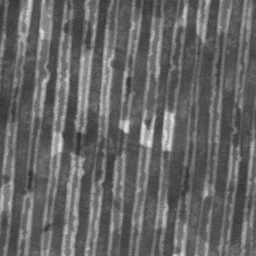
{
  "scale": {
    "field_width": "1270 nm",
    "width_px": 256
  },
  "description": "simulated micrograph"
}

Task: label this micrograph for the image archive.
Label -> parallel lines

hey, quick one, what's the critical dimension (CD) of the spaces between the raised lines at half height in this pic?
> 60.4 nm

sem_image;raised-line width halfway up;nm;47.2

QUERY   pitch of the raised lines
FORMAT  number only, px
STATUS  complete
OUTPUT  22.2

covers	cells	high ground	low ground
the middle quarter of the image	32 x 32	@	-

@---@@@---@----@@----@@@---@@---
@---@@----@@---@@----@@@--@@@---
@---@@----@@---@@----@@@--@@@---
@---@@----@@---@@----@@@--@@@---
@---@@----@@---@@----@@@--@@@---
@---@@---@@----@@----@@@--@@----
@---@@---@@----@@----@@---@@----
@---@@---@@----@@---@@@---@@----
@---@@---@@----@@---@@@---@@----
@---@@---@@----@@---@@@---@@----
@---@@---@@---@@@---@@@---@@----
----@----@@---@@@---@@@--@@@----
---@@@---@@---@@----@@@--@@@---@
---@@----@@---@@----@@---@@----@
---@@@---@@---@@----@@---@@----@
---@@----@@---@@----@@---@@----@
---@@----@@---@@----@@---@@----@
--@@@----@@---@@---@@@---@@----@
--@@@---@@@---@@---@@@---@@----@
--@@@---@@@---@----@@@---@@----@
---@@---@@@--@@----@@@---@-----@
--@@@---@@@--@@----@@@---@-----@
--@@@---@@---@@----@@@--@@-----@
--@@@---@@---@@----@@---@@----@@
--@@@---@@---@@----@@---@@----@@
--@@----@@---@@----@@---@@----@@
--@@@---@@---@@----@@---@@----@@
-@@@@---@@--@@@----@@---@@----@@
-@@@---@@@--@@@---@@@---@@----@@
-@@@---@@@--@@@---@@@---@@----@@
-@@@---@@---@@@---@@@---@@---@@@
-@@@---@@@--@@@---@@----@@---@@@